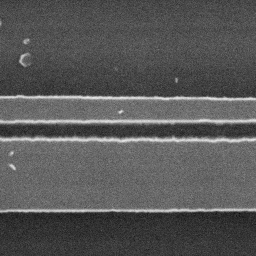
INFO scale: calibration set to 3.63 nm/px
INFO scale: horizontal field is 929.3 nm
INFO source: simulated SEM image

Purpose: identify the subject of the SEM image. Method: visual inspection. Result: lines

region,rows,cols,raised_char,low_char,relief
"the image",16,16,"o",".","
................
................
................
................
................
................
oooooooooooooooo
oooooooooooooooo
oooooooooooooooo
oooooooooooooooo
oooooooooooooooo
oooooooooooooooo
oooooooooooooooo
................
................
................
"